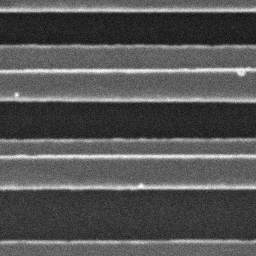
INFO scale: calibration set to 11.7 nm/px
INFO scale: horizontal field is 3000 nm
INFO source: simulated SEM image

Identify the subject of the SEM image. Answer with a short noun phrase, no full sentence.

lines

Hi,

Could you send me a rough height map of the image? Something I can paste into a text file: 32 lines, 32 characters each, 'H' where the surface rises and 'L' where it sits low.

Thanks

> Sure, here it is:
HHHHHHHHHHHHHHHHHHHHHHHHHHHHHHHH
LLLLLLLLLLLLLLLLLLLLLLLLLLLLLLLL
LLLLLLLLLLLLLLLLLLLLLLLLLLLLLLLL
LLLLLLLLLLLLLLLLLLLLLLLLLLLLLLLL
LLLLLLLLLLLLLLLLLLLLLLLLLLLLLLLL
LLLLLLLLLLLLLLLLLLLLLLLLLLLLLLLL
HHHHHHHHHHHHHHHHHHHHHHHHHHHHHHHH
HHHHHHHHHHHHHHHHHHHHHHHHHHHHHHHH
HHHHHHHHHHHHHHHHHHHHHHHHHHHHHHHH
HHHHHHHHHHHHHHHHHHHHHHHHHHHHHHHH
HHHHHHHHHHHHHHHHHHHHHHHHHHHHHHHH
HHHHHHHHHHHHHHHHHHHHHHHHHHHHHHHH
HHHHHHHHHHHHHHHHHHHHHHHHHHHHHHHH
LLLLLLLLLLLLLLLLLLLLLLLLLLLLLLLL
LLLLLLLLLLLLLLLLLLLLLLLLLLLLLLLL
LLLLLLLLLLLLLLLLLLLLLLLLLLLLLLLL
LLLLLLLLLLLLLLLLLLLLLLLLLLLLLLLL
HLLLLHHHHHHHHHHHHHHHHHHHHHHHHHHH
HHHHHHHHHHHHHHHHHHHHHHHHHHHHHHHH
HHHHHHHHHHHHHHHHHHHHHHHHHHHHHHHH
HHHHHHHHHHHHHHHHHHHHHHHHHHHHHHHH
HHHHHHHHHHHHHHHHHHHHHHHHHHHHHHHH
HHHHHHHHHHHHHHHHHHHHHHHHHHHHHHHH
HHHHHHHHHHHHHHHHHHHHHHHHHHLLHHHH
LLLLLLLLLLLLLLLLLLLLLLLLLLLLLLLL
LLLLLLLLLLLLLLLLLLLLLLLLLLLLLLLL
LLLLLLLLLLLLLLLLLLLLLLLLLLLLLLLL
LLLLLLLLLLLLLLLLLLLLLLLLLLLLLLLL
LLLLLLLLLLLLLLLLLLLLLLLLLLLLLLLL
LLLLLLLLLLLLLLLLLLLLLLLLLLLLLLLL
HHHHHHHHHHHHHHHHHHHHHHHHHHHHHHHH
HHHHHHHHHHHHHHHHHHHHHHHHHHHHHHHH